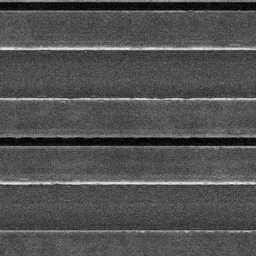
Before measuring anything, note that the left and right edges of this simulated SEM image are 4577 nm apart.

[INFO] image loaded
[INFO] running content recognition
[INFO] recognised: lines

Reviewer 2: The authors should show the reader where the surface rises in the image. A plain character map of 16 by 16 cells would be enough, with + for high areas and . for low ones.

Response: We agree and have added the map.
................
++++++++++++++++
++++++++++++++++
................
................
................
++++++++++++++++
++++++++++++++++
++++++++++++++++
++++++++++++++++
++++++++++++++++
................
................
................
++++++++++++++++
++++++++++++++++